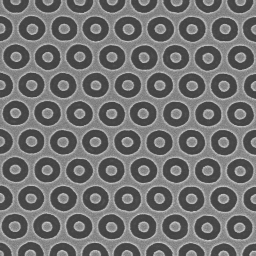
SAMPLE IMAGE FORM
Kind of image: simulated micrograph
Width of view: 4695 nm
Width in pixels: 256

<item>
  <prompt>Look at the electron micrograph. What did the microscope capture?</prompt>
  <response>a regular array of ring-shaped grooves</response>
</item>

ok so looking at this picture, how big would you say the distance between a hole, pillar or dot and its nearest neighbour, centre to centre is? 584 nanometres